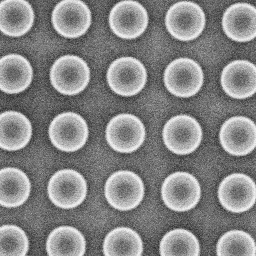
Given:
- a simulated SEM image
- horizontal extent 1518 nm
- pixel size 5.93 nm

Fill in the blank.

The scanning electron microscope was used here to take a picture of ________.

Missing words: an array of small figures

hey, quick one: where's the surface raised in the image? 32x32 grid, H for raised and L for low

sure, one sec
HHHLLLLHHHLLLLLHHLLLLLHHLLLLLLLL
HHHHLLLHHHHLLLHHHHLLLHHHHLLLHHHH
HHHHLLLHHHHLLLHHHHLLLHHHHHLLHHHH
HHHHLLLHHHHLLLHHHHLLLHHHHLLLHHHH
LLLLLLLLHHLLLLLHHLLLLLHHHLLLLHHH
LLLLLLLLLLLLLLLLLLLLLLLLLLLLLLLL
LLLLLLLLLLLLLLLLLLLLLLLLLLLLLLLL
HHHLLLLHHHLLLLLHHLLLLLHHLLLLLLLL
HHHHLLLHHHHLLLHHHHLLLHHHHLLLHHHH
HHHHLLHHHHHLLHHHHHLLLHHHHLLLHHHH
HHHHLLLHHHHLLLHHHHLLLHHHHLLLHHHH
LHLLLLLLHHLLLLLHHLLLLHHHLLLLHHHH
LLLLLLLLLLLLLLLLLLLLLLLLLLLLLLLL
LLLLLLLLLLLLLLLLLLLLLLLLLLLLLLLL
HHHLLLLHHHLLLLLHLLLLLLLLLLLLLLLL
HHHHLLHHHHHLLLHHHHLLLHHHHLLLHHHH
HHHHLLHHHHHLLHHHHHLLHHHHHLLLHHHH
HHHHLLHHHHHLLHHHHHLLLHHHHLLLHHHH
LHLLLLLHHHLLLLHHHLLLLHHHLLLLHHHH
LLLLLLLLLLLLLLLLLLLLLLLLLLLLLLLL
LLLLLLLLLLLLLLLLLLLLLLLLLLLLLLLL
HHHLLLLHHLLLLLLHLLLLLLLLLLLLLLLL
HHHLLLHHHHLLLLHHHLLLLHHHLLLLHHHL
HHHHLLHHHHHLLHHHHHLLHHHHHLLHHHHH
HHHLLLHHHHHLLHHHHHLLHHHHHLLHHHHH
HHLLLLLHHHLLLLHHHLLLLHHHLLLLHHHH
LLLLLLLLLLLLLLLLLLLLLLLLLLLLLLLL
LLLLLLLLLLLLLLLLLLLLLLLLLLLLLLLL
HHLLLLLLHLLLLLLLLLLLLLLLLLLLLLLL
HHHLLLHHHHLLLLHHHLLLLHHHLLLLHHHL
HHHLLLHHHHHLLHHHHHLLHHHHHLLHHHHH
HHHLLLHHHHLLLHHHHHLLHHHHHLLHHHHH